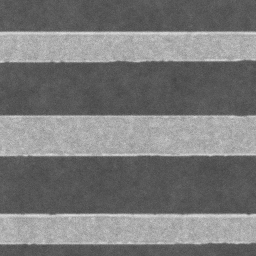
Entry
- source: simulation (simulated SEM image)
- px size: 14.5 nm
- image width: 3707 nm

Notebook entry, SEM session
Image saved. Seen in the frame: lines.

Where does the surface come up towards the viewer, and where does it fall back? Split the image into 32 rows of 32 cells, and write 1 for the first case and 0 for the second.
00000000000000000000000000000000
00000000000000000000000000000000
00000000000000000000000000000000
00000000000000000000000000000000
11111111111111111111111111111111
11111111111111111111111111111111
11111111111111111111111111111111
11111111111111111100100000000000
00000000000000000000000000000000
00000000000000000000000000000000
00000000000000000000000000000000
00000000000000000000000000000000
00000000000000000000000000000000
00000000000000000000000000000000
00000000000000000000000000000000
11111111111111111111111111111111
11111111111111111111111111111111
11111111111111111111111111111111
11111111111111111111111111111111
00000000000000000000000000000000
00000000000000000000000000000000
00000000000000000000000000000000
00000000000000000000000000000000
00000000000000000000000000000000
00000000000000000000000000000000
00000000000000000000000000000000
00000000000000000000000000000000
11111111111111111111111111111111
11111111111111111111111111111111
11111111111111111111111111111111
00000000000000000000000000000000
00000000000000000000000000000000